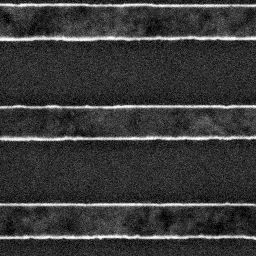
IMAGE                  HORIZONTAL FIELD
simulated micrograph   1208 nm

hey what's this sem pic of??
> lines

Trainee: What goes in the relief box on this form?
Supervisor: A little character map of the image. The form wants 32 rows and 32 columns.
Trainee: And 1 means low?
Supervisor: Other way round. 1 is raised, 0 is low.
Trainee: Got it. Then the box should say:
00000000000000000000000000000000
11111111111111111111111111111111
11111111111111111111111111111111
11111111111111111111111111111111
11111111111111111111111111111111
00000000000000000000000000000000
00000000000000000000000000000000
00000000000000000000000000000000
00000000000000000000000000000000
00000000000000000000000000000000
00000000000000000000000000000000
00000000000000000000000000000000
00000000000000000000000000000000
11111111111111111111111111111111
11111111111111111111111111111111
11111111111111111111111111111111
11111111111111111111111111111111
00000000000000000000000000000000
00000000000000000000000000000000
00000000000000000000000000000000
00000000000000000000000000000000
00000000000000000000000000000000
00000000000000000000000000000000
00000000000000000000000000000000
00000000000000000000000000000000
00000000000000000000000000000000
11111111111111111111111111111111
11111111111111111111111111111111
11111111111111111111111111111111
11111111111111111111111111111111
00000000000000000000000000000000
00000000000000000000000000000000